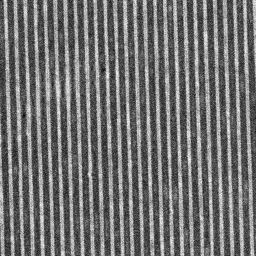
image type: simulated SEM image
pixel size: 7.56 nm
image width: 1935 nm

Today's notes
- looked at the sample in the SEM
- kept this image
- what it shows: parallel lines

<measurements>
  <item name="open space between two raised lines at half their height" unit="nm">55.7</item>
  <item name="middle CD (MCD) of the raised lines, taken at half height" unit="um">0.0217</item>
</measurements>